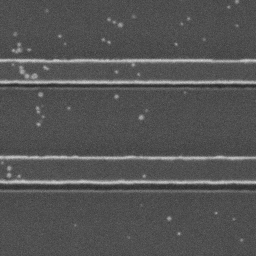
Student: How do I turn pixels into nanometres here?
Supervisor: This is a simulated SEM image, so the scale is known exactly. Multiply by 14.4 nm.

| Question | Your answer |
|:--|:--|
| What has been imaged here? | lines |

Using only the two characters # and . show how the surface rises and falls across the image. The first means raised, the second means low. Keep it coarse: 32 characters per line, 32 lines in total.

................................
................................
................................
................................
................................
................................
................................
................................
################################
################################
................................
................................
................................
................................
................................
................................
................................
................................
................................
................................
################################
################################
################################
................................
................................
................................
................................
................................
................................
................................
................................
................................